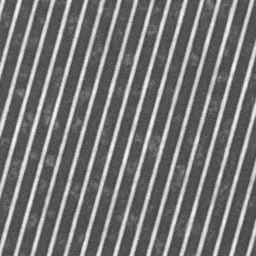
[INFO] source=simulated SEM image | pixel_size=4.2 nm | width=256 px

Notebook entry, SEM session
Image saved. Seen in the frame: parallel lines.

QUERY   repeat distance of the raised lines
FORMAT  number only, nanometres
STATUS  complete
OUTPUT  67.3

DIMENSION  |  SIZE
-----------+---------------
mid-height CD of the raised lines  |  9.6 nanometres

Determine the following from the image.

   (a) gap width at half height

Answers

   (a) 56.2 nanometres